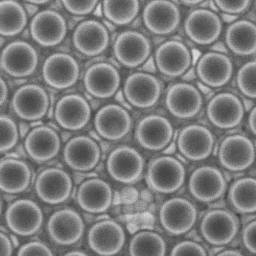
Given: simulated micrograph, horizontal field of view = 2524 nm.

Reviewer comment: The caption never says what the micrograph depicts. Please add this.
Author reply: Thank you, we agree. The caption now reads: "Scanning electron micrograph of a regular array of raised bodies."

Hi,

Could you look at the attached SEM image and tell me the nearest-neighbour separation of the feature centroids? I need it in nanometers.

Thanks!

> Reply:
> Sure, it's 418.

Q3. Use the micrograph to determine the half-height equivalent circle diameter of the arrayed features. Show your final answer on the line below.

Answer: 324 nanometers